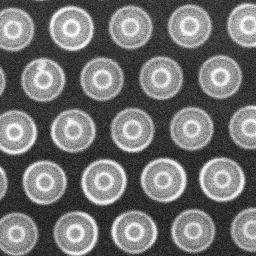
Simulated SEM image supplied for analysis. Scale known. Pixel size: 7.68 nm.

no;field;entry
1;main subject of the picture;an array of small figures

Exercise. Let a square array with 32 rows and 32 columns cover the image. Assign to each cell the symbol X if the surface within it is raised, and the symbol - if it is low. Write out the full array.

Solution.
XXXXXXXXXXXXXXXXXXXXXXXXXXXXXXXX
X-XXXXXX--XXXXX---XXXX---XXXX---
----XXX----XXX-----XX-----XXX---
----XX-----XXX-----XX-----XXX---
----XXX----XXX----XXXX----XXX---
---XXXXX--XXXXX--XXXXXX--XXXXXX-
XXXXXXXXXXXXXXXXXXXXXXXXXXXXXXXX
XXXXXXXXXXXXXXXXXXX--XXXXX---XXX
XXX----XXXX----XXX----XXX-----XX
XXX-----XX-----XXX-----XX-----XX
XXX-----XX-----XXX----XXX-----XX
XXXX---XXXX----XXX----XXXX---XXX
XXXXXXXXXXXXXXXXXXXXXXXXXXXXXXXX
XXXXXXXXXXXXXXXXXXXXXXXXXXXXXXX-
X--XXXXX---XXXX---XXXX----XXX---
----XXX----XXX-----XXX----XXX---
----XXX-----XX-----XXX----XXX---
----XXX----XXXX----XXX----XXXX--
---XXXXX--XXXXXX--XXXXXXXXXXXXXX
XXXXXXXXXXXXXXXXXXXXXXXXXXXXXXXX
XXXXX-XXXXXX--XXXXX---XXXX---XXX
XXX-----XXX----XXX-----XX-----XX
-XX-----XXX-----XX-----XX-----XX
-XX-----XXX----XXX-----XXX----XX
XXXX---XXXX----XXXX---XXXXX--XXX
XXXXXXXXXXXXXXXXXXXXXXXXXXXXXXXX
XXXXXXXXXXXXXXXXXXXXXXXXXXXXXXX-
----XXXX---XXXX----XXX----XXXX--
----XXX-----XX-----XXX----XXX---
----XXX-----XX-----XXX-----XX---
----XXX----XXXX----XXX----XXXX--
X--XXXXXX-XXXXXXXXXXXXXXXXXXXXXX